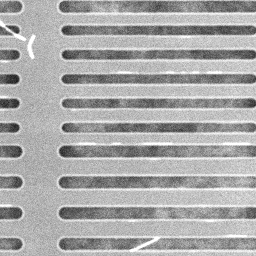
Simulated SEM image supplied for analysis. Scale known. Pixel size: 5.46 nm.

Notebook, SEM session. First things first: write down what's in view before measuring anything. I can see groups of lines, slits or small figures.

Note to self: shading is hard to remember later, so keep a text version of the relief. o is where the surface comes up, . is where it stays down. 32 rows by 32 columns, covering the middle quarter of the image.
oooooooooooooooooooooooooooooooo
oooooooooooooooooooooooooooooooo
................................
................................
................................
oooooooooooooooooooooooooooooooo
oooooooooooooooooooooooooooooooo
oooooooooooooooooooooooooooooooo
................................
................................
................................
oooooooooooooooooooooooooooooooo
oooooooooooooooooooooooooooooooo
oooooooooooooooooooooooooooooooo
o...............................
................................
................................
oooooooooooooooooooooooooooooooo
oooooooooooooooooooooooooooooooo
oooooooooooooooooooooooooooooooo
................................
................................
................................
................................
oooooooooooooooooooooooooooooooo
oooooooooooooooooooooooooooooooo
oooooooooooooooooooooooooooooooo
oooooooooooooooooooooooooooooooo
................................
................................
................................
oooooooooooooooooooooooooooooooo